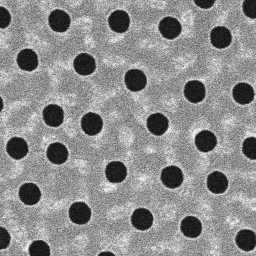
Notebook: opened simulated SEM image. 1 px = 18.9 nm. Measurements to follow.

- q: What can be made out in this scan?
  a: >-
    a regular array of holes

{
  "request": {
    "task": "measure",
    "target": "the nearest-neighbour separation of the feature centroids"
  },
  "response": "928 nm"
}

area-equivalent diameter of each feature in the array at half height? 22.9 px